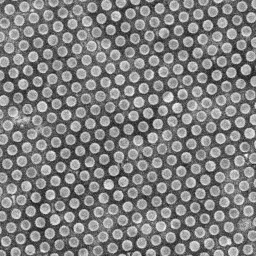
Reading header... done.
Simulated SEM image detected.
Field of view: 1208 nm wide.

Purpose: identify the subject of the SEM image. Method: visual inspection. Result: a regular array of raised bodies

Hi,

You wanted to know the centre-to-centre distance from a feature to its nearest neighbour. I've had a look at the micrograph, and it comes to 68.2 nm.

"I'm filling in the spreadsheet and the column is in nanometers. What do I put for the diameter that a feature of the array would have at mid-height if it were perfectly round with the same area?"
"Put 46.8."